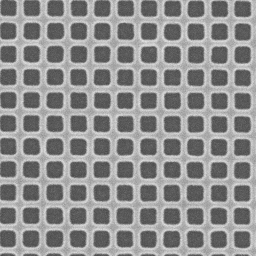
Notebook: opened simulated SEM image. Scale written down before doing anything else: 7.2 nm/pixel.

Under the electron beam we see a regular array of holes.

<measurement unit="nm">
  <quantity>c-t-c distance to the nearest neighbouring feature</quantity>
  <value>165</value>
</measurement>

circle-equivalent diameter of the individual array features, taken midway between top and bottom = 138 nanometres